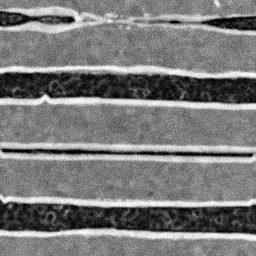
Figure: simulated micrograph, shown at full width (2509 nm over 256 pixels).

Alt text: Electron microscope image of one or a few lines or trenches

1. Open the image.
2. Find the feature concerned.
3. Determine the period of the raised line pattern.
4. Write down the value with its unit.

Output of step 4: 629 nm